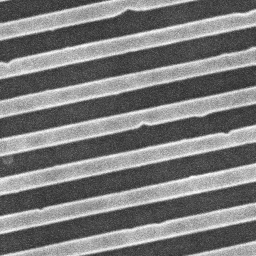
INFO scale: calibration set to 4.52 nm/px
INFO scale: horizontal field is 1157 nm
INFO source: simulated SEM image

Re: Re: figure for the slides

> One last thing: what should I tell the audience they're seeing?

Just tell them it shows parallel lines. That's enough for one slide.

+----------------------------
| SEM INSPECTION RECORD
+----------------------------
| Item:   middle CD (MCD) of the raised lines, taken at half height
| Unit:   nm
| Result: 69.7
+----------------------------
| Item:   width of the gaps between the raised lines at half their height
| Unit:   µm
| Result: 0.101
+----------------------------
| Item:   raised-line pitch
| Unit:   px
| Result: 37.9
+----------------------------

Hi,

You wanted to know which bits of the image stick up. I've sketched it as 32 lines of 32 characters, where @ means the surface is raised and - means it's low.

------------@@@@@@@@@@----------
-------@@@@@@@@----------------@
--@@@@@@@@@@--------------@@@@@@
@@@@@@@--------------@@@@@@@@@--
@@--------------@@@@@@@@@@------
-----------@@@@@@@@@@-----------
------@@@@@@@@@@--------------@@
--@@@@@@@@@--------------@@@@@@@
@@@@@@--------------@@@@@@@@@@--
@@-------------@@@@@@@@@--------
----------@@@@@@@@@-------------
------@@@@@@@@@--------------@@@
-@@@@@@@@@--------------@@@@@@@@
@@@@@--------------@@@@@@@@@@---
@-------------@@@@@@@@@@--------
----------@@@@@@@@@-------------
-----@@@@@@@@@---------------@@@
@@@@@@@@@---------------@@@@@@@@
@@@@@-------------@@@@@@@@@@----
--------------@@@@@@@@@---------
---------@@@@@@@@@--------------
----@@@@@@@@@--------------@@@@@
@@@@@@@@@-------------@@@@@@@@@@
@@@@--------------@@@@@@@@@@----
-------------@@@@@@@@@----------
--------@@@@@@@@@---------------
---@@@@@@@@@@--------------@@@@@
@@@@@@@@--------------@@@@@@@@@@
@@@--------------@@@@@@@@@------
------------@@@@@@@@@@----------
-------@@@@@@@@@@--------------@
---@@@@@@@@@--------------@@@@@@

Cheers